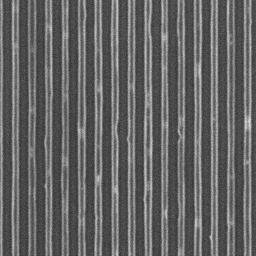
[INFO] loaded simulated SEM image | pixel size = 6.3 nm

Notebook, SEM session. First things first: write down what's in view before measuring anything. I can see parallel lines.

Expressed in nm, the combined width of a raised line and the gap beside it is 104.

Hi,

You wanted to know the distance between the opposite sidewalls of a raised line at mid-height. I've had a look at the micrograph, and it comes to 0.0347 µm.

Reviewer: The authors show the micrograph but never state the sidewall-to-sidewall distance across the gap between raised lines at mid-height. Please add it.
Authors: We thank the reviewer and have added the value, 68.6 nanometres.